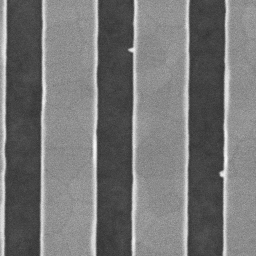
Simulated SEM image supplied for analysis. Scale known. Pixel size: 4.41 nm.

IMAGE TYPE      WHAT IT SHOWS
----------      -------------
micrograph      wiring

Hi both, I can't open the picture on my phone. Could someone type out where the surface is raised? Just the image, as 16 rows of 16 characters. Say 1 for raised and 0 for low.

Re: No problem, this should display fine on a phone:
0001110011110011
0001110011110011
0001110011110011
0001110011110011
0001110011110011
0001110011110011
0001110011110011
0001110011110011
0001110011110011
0001110011110011
0001110011110011
0001110011110011
0001110011110011
0001110011110011
0001110011110011
0001110011110011